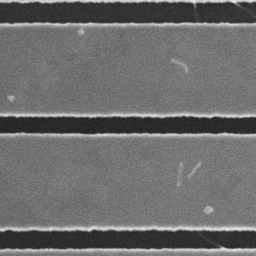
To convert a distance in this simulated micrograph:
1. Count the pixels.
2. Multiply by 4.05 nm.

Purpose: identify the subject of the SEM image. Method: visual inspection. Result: lines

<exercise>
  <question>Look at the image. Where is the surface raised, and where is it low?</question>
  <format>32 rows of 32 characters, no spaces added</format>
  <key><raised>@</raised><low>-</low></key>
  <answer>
--------------------------------
--------------------------------
--------------------------------
@@@@@@@@@@@@@@@@@@@@@@@@@@@@@@@@
@@@@@@@@@@@@@@@@@@@@@@@@@@@@@@@@
@@@@@@@@@@@@@@@@@@@@@@@@@@@@@@@@
@@@@@@@@@@@@@@@@@@@@@@@@@@@@@@@@
@@@@@@@@@@@@@@@@@@@@@@@@@@@@@@@@
@@@@@@@@@@@@@@@@@@@@@@@@@@@@@@@@
@@@@@@@@@@@@@@@@@@@@@@@@@@@@@@@@
@@@@@@@@@@@@@@@@@@@@@@@@@@@@@@@@
@@@@@@@@@@@@@@@@@@@@@@@@@@@@@@@@
@@@@@@@@@@@@@@@@@@@@@@@@@@@@@@@@
@@@@@@@@@@@@@@@@@@@@@@@@@@@@@@@@
@-@@@@@@@@@@@@@@@@@@@@@-@@@@@@@@
--------------------------------
--------------------------------
@@@@@@@@@@@@@@@@@@@@@@@@@@@@@@@@
@@@@@@@@@@@@@@@@@@@@@@@@@@@@@@@@
@@@@@@@@@@@@@@@@@@@@@@@@@@@@@@@@
@@@@@@@@@@@@@@@@@@@@@@@@@@@@@@@@
@@@@@@@@@@@@@@@@@@@@@@@@@@@@@@@@
@@@@@@@@@@@@@@@@@@@@@@@@@@@@@@@@
@@@@@@@@@@@@@@@@@@@@@@@@@@@@@@@@
@@@@@@@@@@@@@@@@@@@@@@@@@@@@@@@@
@@@@@@@@@@@@@@@@@@@@@@@@@@@@@@@@
@@@@@@@@@@@@@@@@@@@@@@@@@@@@@@@@
@@@@@@@@@@@@@@@@@@@@@@@@@@@@@@@@
@@@@@@@@@@@@@@@@@@@@@@@@@@@@@@@@
--------------------------------
--------------------------------
@@@@@@@@@@@@@@@@@@@@@@@@@@@@@@@@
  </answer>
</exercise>